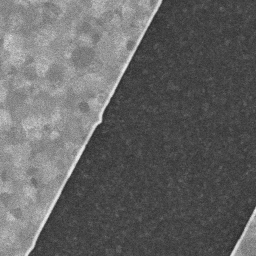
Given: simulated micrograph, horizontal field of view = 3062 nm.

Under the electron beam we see one or a few lines or trenches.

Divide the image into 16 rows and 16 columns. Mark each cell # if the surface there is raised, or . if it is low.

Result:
##########......
#########.......
#########.......
########........
########........
#######.........
#######.........
######..........
######..........
#####...........
#####...........
####............
###.............
###.............
##.............#
##.............#